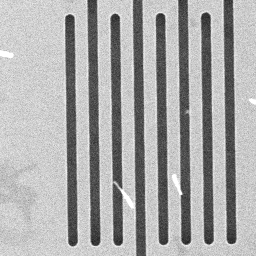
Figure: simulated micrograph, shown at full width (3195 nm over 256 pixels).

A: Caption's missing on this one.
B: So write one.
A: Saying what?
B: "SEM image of groups of lines, slits or small figures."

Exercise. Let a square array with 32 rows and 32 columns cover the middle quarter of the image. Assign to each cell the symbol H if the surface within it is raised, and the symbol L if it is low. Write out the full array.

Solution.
LLLHHHLLLHHLLLHHHLLLHHHLLLHHHLLH
LLLHHHLLLHHLLLHHHLLLHHHLLLHHHLLH
LLLHHHLLLHHLLLHHHLLLHHHLLLHHHLLH
LLLHHHLLLHHLLLHHHLLLHHHLLLHHHLLH
LLLHHHLLLHHHLLHHHLLLHHHLLLHHHLLH
LLLHHHLLLHHHLLHHHLLLHHHLLLHHHLLH
LLLHHHLLLHHHLLHHHLLLHHHLLLHHHLLL
LLLHHHLLLHHHLLHHHLLLHHHLLLHHHLLL
LLLHHHLLLHHHLLHHHLLLHHHLLLHHHLLL
LLLHHHLLLHHHLLHHHLLLHHHLLLHHHLLL
LLLHHHLLLHHHLLHHHLLLHHHLLLHHHLLL
LLLHHHLLLHHHLLHHHLLLHHHLLLHHHLLL
LLLHHHLLLHHHLLHHHLLLHHHLLLHHHLLL
LLLHHHLLLHHHLLLHHLLLHHHLLLHHHLLL
LLLHHHLLLHHHLLLHHHLLHHHLLLHHHLLL
LLLHHHLLLHHHLLLHHHLLHHHLLLHHHLLL
LLLHHHLLLHHHLLLHHHLLHHHLLLHHHLLL
LLLHHHLLLHHHLLLHHHLLHHHLLLHHHLLL
LLLHHHLLLHHHLLLHHHLLHHHLLLHHHLLL
LLLHHHLLLHHHLLLHHHLLHHHLLLHHHLLL
LLLHHHLLLHHHLLLHHHLLHHHLLLHHHLLL
HLLHHHLLLHHHLLLHHHLLHHHLLLHHHLLL
HLLHHHLLLHHHLLLHHHLLHHHLLLHHHLLL
HLLHHHLLLHHHLLLHHHLLHHHLLLHHHLLL
HLLHHHLLLHHHLLLHHHLLHHHLLLHHHLLL
HLLHHHLLLHHHLLLHHHLLHHHLLLHHHLLL
HLLHHHLLLHHHLLLHHHLLHHHLLLHHHLLL
HLLHHHLLLHHHLLLHHHLLHHHLLLHHHLLL
HLLHHHLLLHHHLLLHHHLLHHHLLLHHHLLL
HLLLHHLLLHHHLLLHHHLLHHHLLLHHHLLL
HLLLHHLLLHHHLLLHHHLLHHHLLLHHHLLL
HLLLHHLLLHHHLLHHHHLLHHHLLLHHHLLL